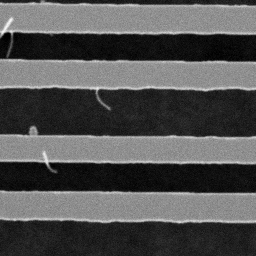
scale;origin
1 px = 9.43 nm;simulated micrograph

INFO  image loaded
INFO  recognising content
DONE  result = lines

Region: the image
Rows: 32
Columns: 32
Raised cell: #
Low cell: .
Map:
########..##....................
################################
################################
################################
................................
................................
................................
####............................
################################
################################
################################
................................
................................
................................
................................
................................
................................
################################
################################
################################
................................
................................
................................
................................
################################
################################
################################
...#...#.#######################
................................
................................
................................
................................